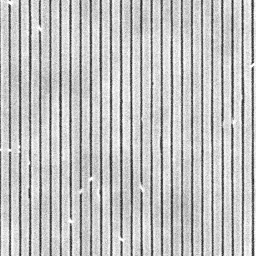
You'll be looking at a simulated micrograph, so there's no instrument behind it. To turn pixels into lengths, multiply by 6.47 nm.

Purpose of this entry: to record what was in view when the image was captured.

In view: parallel lines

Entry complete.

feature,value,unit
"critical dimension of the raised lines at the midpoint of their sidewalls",46.1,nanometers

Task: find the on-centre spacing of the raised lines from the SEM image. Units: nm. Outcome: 65.5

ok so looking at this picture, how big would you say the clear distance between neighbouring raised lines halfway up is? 17.8 nm